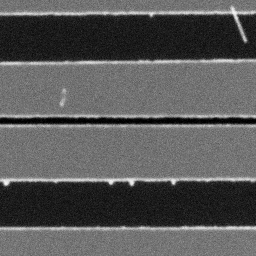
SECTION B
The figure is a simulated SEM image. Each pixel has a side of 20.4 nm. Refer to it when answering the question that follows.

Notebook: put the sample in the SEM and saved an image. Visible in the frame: lines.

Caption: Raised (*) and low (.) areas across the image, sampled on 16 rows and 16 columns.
****************
................
................
................
****************
****************
****************
***.************
****************
****************
****************
................
................
................
****************
****************